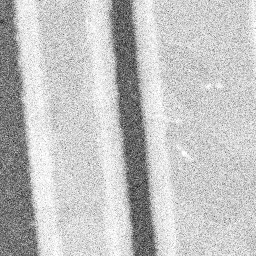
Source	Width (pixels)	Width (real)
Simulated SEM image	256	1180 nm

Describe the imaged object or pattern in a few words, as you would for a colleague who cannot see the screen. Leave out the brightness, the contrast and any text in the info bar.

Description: one or a few lines or trenches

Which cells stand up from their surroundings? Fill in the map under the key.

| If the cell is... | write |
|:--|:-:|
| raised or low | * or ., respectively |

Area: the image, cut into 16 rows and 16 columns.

..****...*******
..****...*******
..****...*******
..****...*******
..*****..*******
..*****..*******
..*****..*******
..*****...******
..*****...******
..*****...******
...****...******
...****...******
...****...******
...****...******
...*****..******
...*****..******